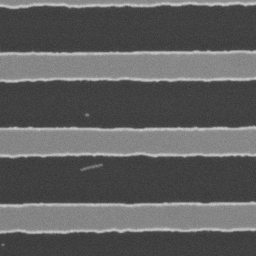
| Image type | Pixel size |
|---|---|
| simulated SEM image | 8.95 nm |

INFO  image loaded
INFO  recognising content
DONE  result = lines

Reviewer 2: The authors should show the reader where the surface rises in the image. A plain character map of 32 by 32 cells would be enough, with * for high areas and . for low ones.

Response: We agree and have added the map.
***********************.*****.**
................................
................................
................................
................................
................................
.................***.***********
********************************
********************************
********************************
................................
................................
................................
................................
................................
................................
********************************
********************************
********************************
***..*..........................
................................
................................
................................
................................
................................
...****.***..***.***************
********************************
********************************
********************************
................................
................................
................................